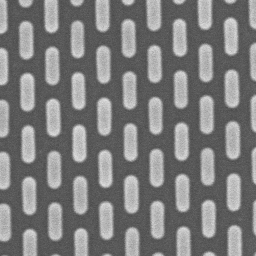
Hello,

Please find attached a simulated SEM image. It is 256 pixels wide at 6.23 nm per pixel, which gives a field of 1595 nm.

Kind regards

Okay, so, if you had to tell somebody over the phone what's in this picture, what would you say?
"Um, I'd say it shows groups of lines, slits or small figures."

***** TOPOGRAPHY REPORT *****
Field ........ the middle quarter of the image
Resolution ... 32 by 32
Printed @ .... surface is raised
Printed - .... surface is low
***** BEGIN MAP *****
--------@@@----------@@@--------
--------@@@----------@@@--------
---@-----@@----@@----@@@----@@--
--@@@----@@----@@@---@@@----@@@-
--@@@----@@----@@@----@-----@@@-
--@@@----------@@@----------@@@-
--@@@----------@@@----------@@@-
--@@@----------@@@----------@@@-
--@@@----------@@@----------@@@-
--@@@----@@----@@@---@@@----@@@-
--@@@----@@@---@@@---@@@----@@--
---------@@@---------@@@--------
---------@@@---------@@@--------
---------@@@---------@@@--------
---------@@@---------@@@--------
---------@@@----@@---@@@----@@@-
--@@@----@@@---@@@----@@----@@@-
--@@@----@@----@@@----------@@@-
--@@@----------@@@----------@@@-
--@@@----------@@@----------@@@-
--@@@----------@@@----------@@@-
--@@@----------@@@-----@----@@@-
--@@@----@@@---@@@----@@----@@@-
--@@@----@@@----@@----@@----@@@-
---------@@@----------@@@-------
---------@@@----------@@@-------
---------@@@----------@@@-------
---------@@@----------@@@-------
---@@----@@@----@@----@@@---@@@-
--@@@----@@@---@@@----@@@---@@@-
--@@@----@@----@@@-----@----@@@-
--@@@@---------@@@----------@@@-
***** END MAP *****